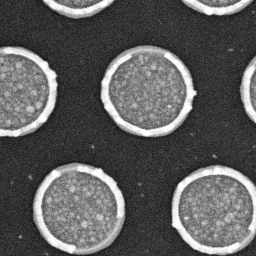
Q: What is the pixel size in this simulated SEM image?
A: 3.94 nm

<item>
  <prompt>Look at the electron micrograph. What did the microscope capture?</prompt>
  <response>raised bodies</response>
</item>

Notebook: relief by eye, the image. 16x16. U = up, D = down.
DDDUUUDDDDDDUUUD
DDDDDDDDDDDDDDDD
DDDDDDDDDDDDDDDD
UUDDDDDDUUUDDDDD
UUUDDDDUUUUUDDDU
UUUUDDUUUUUUDDDU
UUUDDDUUUUUUDDDU
UUUDDDDUUUUDDDDD
UDDDDDDDDDDDDDDD
DDDDDDDDDDDDDDDD
DDDDUUDDDDDDDUDD
DDDUUUUDDDDUUUUU
DDUUUUUUDDDUUUUU
DDUUUUUUDDDUUUUU
DDDUUUUDDDDUUUUU
DDDDUUDDDDDDUUUD